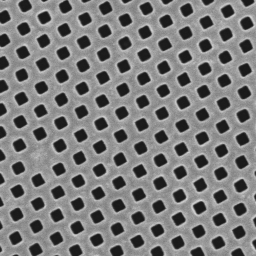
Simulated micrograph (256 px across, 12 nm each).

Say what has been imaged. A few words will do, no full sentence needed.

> a regular array of holes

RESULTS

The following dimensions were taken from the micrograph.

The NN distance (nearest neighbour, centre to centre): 275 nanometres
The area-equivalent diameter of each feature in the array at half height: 0.153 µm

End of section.